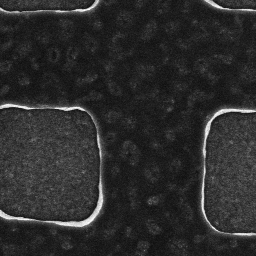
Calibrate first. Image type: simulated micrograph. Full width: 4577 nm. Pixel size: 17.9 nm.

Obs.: holes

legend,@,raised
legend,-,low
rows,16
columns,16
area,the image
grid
-----@@@@@@@@@--
@@@@@@@@@@@@@@@@
@@@@@@@@@@@@@@@@
@@@@@@@@@@@@@@@@
@@@@@@@@@@@@@@@@
@@@@@@@@@@@@@@@@
@@@@@@@@@@@@@@@@
------@@@@@@@---
------@@@@@@@---
------@@@@@@@---
------@@@@@@@---
------@@@@@@@---
------@@@@@@@---
------@@@@@@@---
@@@@@@@@@@@@@@--
@@@@@@@@@@@@@@@@